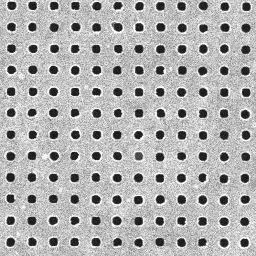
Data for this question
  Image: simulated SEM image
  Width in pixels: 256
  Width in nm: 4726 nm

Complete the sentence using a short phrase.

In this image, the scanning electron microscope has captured a regular array of holes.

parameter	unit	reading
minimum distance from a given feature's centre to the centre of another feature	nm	388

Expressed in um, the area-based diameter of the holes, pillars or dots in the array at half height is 0.17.